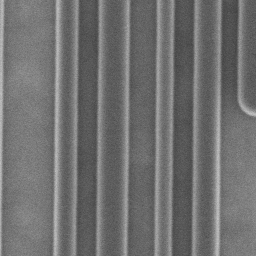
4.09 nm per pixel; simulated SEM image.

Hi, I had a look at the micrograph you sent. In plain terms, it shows groups of lines, slits or small figures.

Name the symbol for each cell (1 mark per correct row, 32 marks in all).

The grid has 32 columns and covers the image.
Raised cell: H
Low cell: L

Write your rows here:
LLLLLLLHHHLLHHHHLLLLHHLLHHHHLLHH
LLLLLLLHHHLLHHHHLLLLHHLLHHHHLLHH
LLLLLLLHHHLLHHHHLLLLHHLLHHHHLLHH
LLLLLLLHHHLLHHHHLLLLHHLLHHHHLLHH
LLLLLLLHHHLLHHHHLLLLHHLLHHHHLLHH
LLLLLLLHHHLLHHHHLLLLHHLLHHHHLLHH
LLLLLLLHHHLLHHHHLLLLHHLLHHHHLLHH
LLLLLLLHHHLLHHHHLLLLHHLLHHHHLLHH
LLLLLLLHHHLLHHHHLLLLHHLLHHHHLLHH
LLLLLLLHHHLLHHHHLLLLHHLLHHHHLLHH
LLLLLLLHHHLLHHHHLLLLHHLLHHHHLLHH
LLLLLLLHHHLLHHHHLLLLHHLLHHHLLLHH
LLLLLLLHHHLLHHHHLLLLHLLLHHHLLLHH
LLLLLLLHHHLLHHHHLLLLHLLLHHHLLLHH
LLLLLLLHHHLLHHHHLLLLHLLLHHHLLLLL
LLLLLLLHHHLLHHHHLLLLHLLLHHHLLLLL
LLLLLLLHHHLLHHHHLLLLHLLLHHHLLLLL
LLLLLLLHHHLLHHHHLLLLHLLLHHHLLLLL
LLLLLLLHHHLLHHHHLLLLHLLLHHHLLLLL
LLLLLLLHHHLLHHHHLLLLHLLLHHHLLLLL
LLLLLLLHHHLLHHHHLLLLHLLLHHHLLLLL
LLLLLLLHHHLLHHHHLLLHHLLLHHHLLLLL
LLLLLLLHHHLLHHHHLLLHHLLLHHHLLLLL
LLLLLLLHHHLLHHHHLLLHHLLLHHHLLLLL
LLLLLLLHHHLLHHHHLLLHHLLLHHHLLLLL
LLLLLLLHHHLLHHHHLLLHHLLLHHHLLLLL
LLLLLLLHHLLLHHHHLLLHHLLLHHHLLLLL
LLLLLLLHHLLLHHHHLLLHHLLLHHHLLLLL
LLLLLLLHHLLLHHHHLLLHHLLLHHHLLLLL
LLLLLLLHHLLLHHHHLLLHHLLLHHHLLLLL
LLLLLLLHHLLLHHHHLLLHHLLLHHHLLLLL
LLLLLLLHHLLLHHHHLLLHHLLLHHHLLLLL